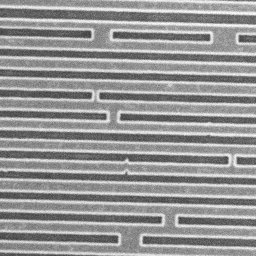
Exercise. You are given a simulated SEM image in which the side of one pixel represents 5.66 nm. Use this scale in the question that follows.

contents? parallel lines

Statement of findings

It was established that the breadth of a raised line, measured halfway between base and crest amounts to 0.0636 microns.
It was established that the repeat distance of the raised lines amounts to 115 nm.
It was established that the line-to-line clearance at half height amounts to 53 nm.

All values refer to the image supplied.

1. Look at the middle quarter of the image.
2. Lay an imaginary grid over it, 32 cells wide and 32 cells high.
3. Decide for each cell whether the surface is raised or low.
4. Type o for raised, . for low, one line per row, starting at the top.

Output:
oooooooooooooooooooooooooooooooo
....oooooooooooooooooooooooooooo
................................
................................
ooooooooooooooooooooooooooo.....
oooooooooooooooooooooooooooooooo
oooooooooooooooooooooooooooooooo
.......oo.......................
.......oo.......................
oooooooooooooooooooooo..........
oooooooooooooooooooooooooooooooo
oooooooooooooooooooooooooooooooo
...........ooo..............oooo
...........ooo..................
oooooooooooooooo................
oooooooooooooooooooooooooooooooo
oooooooooooooooooooooooooooooooo
...............................o
................................
oooooooooo......................
oooooooooooooooooooooooooooooooo
oooooooooooooooooooooooooooooooo
.........................ooooo..
................................
ooooooooooooo..o................
oooooooooooooooooooooooooooooooo
oooooooooooooooooooooooooooooooo
...................ooooooooooooo
................................
ooooooo.........................
oooooooooooooooooooooooooooooooo
oooooooooooooooooooooooooooooooo